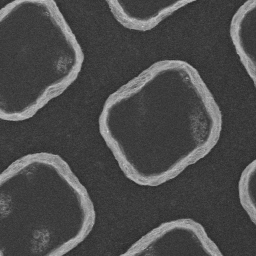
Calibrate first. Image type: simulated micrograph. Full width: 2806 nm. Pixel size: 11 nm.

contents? raised bodies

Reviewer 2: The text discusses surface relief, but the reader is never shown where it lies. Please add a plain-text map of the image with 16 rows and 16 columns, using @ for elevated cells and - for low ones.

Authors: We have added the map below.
-@@----@@@@----@
@@@@-----------@
@@@@@----------@
@@@@@----------@
@@@@@-----@@----
@@@@----@@@@@---
@@-----@@@@@@---
------@@@@@@@@--
-------@@@@@@---
-------@@@@@@---
-@@@----@@@-----
@@@@@----------@
@@@@@----------@
@@@@@@----------
@@@@@-----@@----
@@@@-----@@@@---